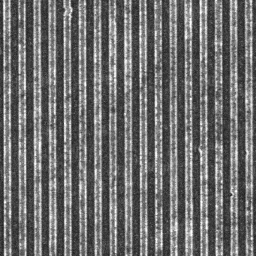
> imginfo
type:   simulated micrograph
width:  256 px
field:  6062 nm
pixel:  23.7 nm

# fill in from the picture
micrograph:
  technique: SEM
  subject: parallel lines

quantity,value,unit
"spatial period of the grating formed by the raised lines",358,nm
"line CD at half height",0.142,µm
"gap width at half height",201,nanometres